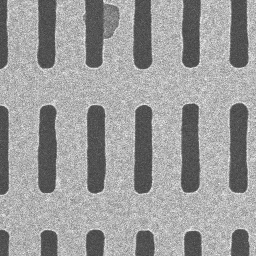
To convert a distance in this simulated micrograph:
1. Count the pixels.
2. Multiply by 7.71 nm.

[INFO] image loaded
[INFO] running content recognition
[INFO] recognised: holes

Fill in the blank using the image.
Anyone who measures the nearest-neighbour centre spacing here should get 364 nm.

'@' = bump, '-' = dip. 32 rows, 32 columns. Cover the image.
-@@@@--@@@@--@@@@--@@@@--@@@@--@
-@@@@--@@@@----@@--@@@@--@@@@--@
-@@@@--@@@-----@@--@@@@--@@@@--@
-@@@@--@@@@----@@--@@@@--@@@@--@
-@@@@--@@@@---@@@--@@@@--@@@@--@
-@@@@--@@@@--@@@@--@@@@--@@@@--@
-@@@@--@@@@--@@@@--@@@@--@@@@--@
-@@@@--@@@@--@@@@--@@@@--@@@@--@
@@@@@@@@@@@@@@@@@-@@@@@@@@@@@@@@
@@@@@@@@@@@@@@@@@@@@@@@@@@@@@@@@
@@@@@@@@@@@@@@@@@@@@@@@@@@@@@@@@
@@@@@@@@@@@@@@@@@@@@@@@@@@@@@@@@
@@@@@@@@@@@@@@@@@@@@@@@@@@@@@@@@
-@@@@--@@@@--@@@@--@@@@--@@@@--@
-@@@@--@@@@--@@@@--@@@@--@@@@--@
-@@@@--@@@@--@@@@--@@@@--@@@@--@
-@@@@--@@@@--@@@@--@@@@--@@@@--@
-@@@@--@@@@--@@@@--@@@@--@@@@--@
-@@@@--@@@@--@@@@--@@@@--@@@@--@
-@@@@--@@@@--@@@@--@@@@--@@@@--@
-@@@@--@@@@--@@@@--@@@@--@@@@--@
-@@@@--@@@@--@@@@--@@@@--@@@@--@
-@@@@--@@@@--@@@@--@@@@--@@@@--@
-@@@@--@@@@--@@@@--@@@@--@@@@--@
@@@@@@@@@@@@@@@@@@@@@@@@@@@@@@@@
@@@@@@@@@@@@@@@@@@@@@@@@@@@@@@@@
@@@@@@@@@@@@@@@@@@@@@@@@@@@@@@@@
@@@@@@@@@@@@@@@@@@@@@@@@@@@@@@@@
@@@@@@@@@@@@@@@@@@@@@@@@@@@@@@@@
-@@@@--@@@@--@@@@--@@@@--@@@@--@
-@@@@--@@@@--@@@@--@@@@--@@@@--@
-@@@@--@@@@--@@@@--@@@@--@@@@--@